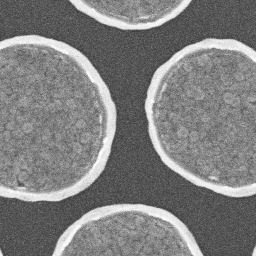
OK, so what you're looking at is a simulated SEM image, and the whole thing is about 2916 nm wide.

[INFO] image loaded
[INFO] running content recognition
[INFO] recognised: raised bodies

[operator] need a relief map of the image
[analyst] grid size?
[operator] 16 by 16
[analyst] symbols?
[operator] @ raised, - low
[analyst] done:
-----@@@@@@-----
-------@@@------
----------------
@@@@@------@@@@@
@@@@@@----@@@@@@
@@@@@@----@@@@@@
@@@@@@@--@@@@@@@
@@@@@@@--@@@@@@@
@@@@@@@---@@@@@@
@@@@@@@---@@@@@@
@@@@@@-----@@@@@
@@@@@--------@@@
----------------
------@@@@------
----@@@@@@@-----
----@@@@@@@@----